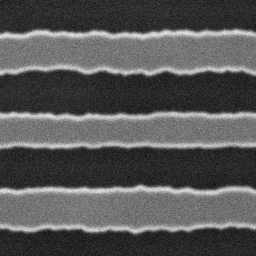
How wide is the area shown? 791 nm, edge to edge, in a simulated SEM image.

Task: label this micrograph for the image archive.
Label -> lines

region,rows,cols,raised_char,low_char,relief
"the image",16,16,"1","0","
0000000000000000
0000000000000000
1111111111111111
1111111111111111
1000010111010001
0000000000000000
0000000000000000
1111111111111111
1111111111111111
0000000000000000
0000000000000000
0000000000000000
1111111111111111
1111111111111111
0000000000000000
0000000000000000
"